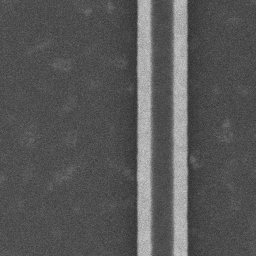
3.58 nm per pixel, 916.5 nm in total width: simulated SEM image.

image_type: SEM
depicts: one or a few lines or trenches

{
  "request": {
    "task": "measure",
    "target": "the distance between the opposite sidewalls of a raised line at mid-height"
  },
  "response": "0.131 microns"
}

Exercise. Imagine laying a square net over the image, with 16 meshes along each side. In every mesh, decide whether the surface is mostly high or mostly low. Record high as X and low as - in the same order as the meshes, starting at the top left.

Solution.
---------XX-----
---------XX-----
---------XX-----
---------XX-----
---------XX-----
---------XX-----
---------XX-----
---------XX-----
---------XX-----
---------XX-----
---------XX-----
---------XX-----
---------XX-----
---------XX-----
---------XX-----
---------XX-----